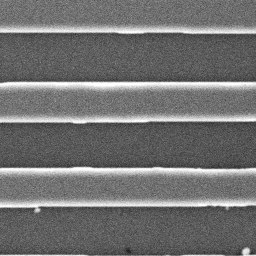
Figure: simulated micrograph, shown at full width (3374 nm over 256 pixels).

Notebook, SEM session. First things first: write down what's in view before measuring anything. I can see lines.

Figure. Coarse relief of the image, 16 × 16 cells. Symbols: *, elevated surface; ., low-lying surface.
****************
****************
................
................
................
****************
****************
****************
................
................
................
****************
****************
................
................
................